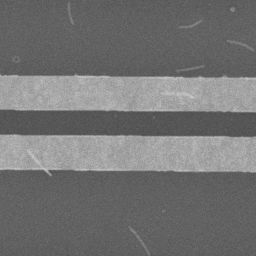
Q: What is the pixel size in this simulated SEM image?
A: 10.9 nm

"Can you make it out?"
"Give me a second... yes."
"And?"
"lines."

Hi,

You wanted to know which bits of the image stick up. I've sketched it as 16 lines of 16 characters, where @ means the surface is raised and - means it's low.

----------------
----------------
----------------
----------------
----------------
@@@@@@@@@@@@@@@@
@@@@@@@@@@@@@@@@
----------------
@@--------------
@@@@@@@@@@@@@@@@
@@@@@@@@@@@@@@@@
----------------
----------------
----------------
----------------
----------------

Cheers